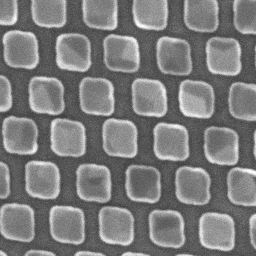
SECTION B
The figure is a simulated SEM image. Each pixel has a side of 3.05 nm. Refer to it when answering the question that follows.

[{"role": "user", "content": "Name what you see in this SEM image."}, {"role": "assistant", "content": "a regular array of raised bodies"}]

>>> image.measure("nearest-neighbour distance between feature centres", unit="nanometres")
146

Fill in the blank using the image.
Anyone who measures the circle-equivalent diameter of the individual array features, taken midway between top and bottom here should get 116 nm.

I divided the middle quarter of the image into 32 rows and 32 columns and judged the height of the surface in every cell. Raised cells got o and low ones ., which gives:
oooooo.....oooooooo.....oooooooo
....oo......oooooo......oooooooo
...........................oooo.
.....o..........................
....ooooooo......ooooooo......oo
....oooooooo.....oooooooo....ooo
....oooooo.o.....oooooooo....ooo
....ooooo..o.....oooooo......ooo
....ooooo..o.....ooooo..oo...ooo
....oooooooo.....ooooo.ooo...ooo
....oooooooo.....ooooo.ooo...ooo
.....ooooooo......oooo.ooo...ooo
........ooo........oooooo.....oo
................................
oooo......ooooooo...............
ooooo.....oooooooo.....oooooo...
ooooo.....oooooooo.....oooo..o..
ooooo.....oooooooo.....oooooooo.
ooooo.....oooooooo.....oooooooo.
ooooo.....oooooooo.....oooooooo.
ooooo.....oooooooo.....oooooooo.
ooooo.....oooooooo.....oooooooo.
ooooo......ooooooo.....oo..oooo.
........................oooooo..
................................
....oooo.........ooo............
...oooooooo.....ooooooo......ooo
...oooooooo.....oooooooo....oooo
...oooooooo.....oooooooo....oooo
...oooooooo.....oooooooo....oooo
...ooooooooo...ooooooooo....oooo
...ooooooooo....oooo..oo....oooo